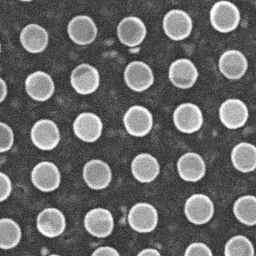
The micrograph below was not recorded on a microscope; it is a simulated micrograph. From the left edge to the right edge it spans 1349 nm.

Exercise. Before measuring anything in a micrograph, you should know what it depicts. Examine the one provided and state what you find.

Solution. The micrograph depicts a regular array of raised bodies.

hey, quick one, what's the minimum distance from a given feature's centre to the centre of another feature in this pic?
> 238 nm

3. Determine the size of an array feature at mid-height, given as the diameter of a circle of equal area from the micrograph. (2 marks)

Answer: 0.146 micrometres